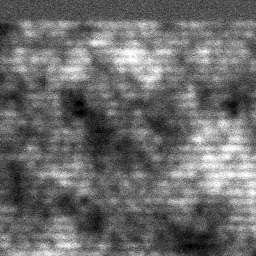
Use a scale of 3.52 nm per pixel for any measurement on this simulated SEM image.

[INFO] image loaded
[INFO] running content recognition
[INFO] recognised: parallel lines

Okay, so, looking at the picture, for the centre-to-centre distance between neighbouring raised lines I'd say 30.9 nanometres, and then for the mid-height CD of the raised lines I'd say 18.5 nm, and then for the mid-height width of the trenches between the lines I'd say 12.3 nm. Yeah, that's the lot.